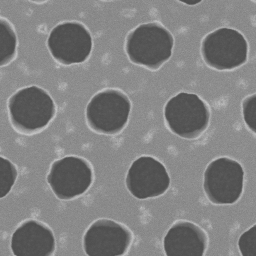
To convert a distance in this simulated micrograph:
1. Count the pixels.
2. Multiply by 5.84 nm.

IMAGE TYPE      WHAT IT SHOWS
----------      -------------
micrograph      a regular array of holes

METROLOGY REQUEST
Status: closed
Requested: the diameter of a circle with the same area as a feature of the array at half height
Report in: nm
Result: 246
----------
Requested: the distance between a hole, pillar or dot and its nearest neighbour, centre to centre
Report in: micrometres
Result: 0.442